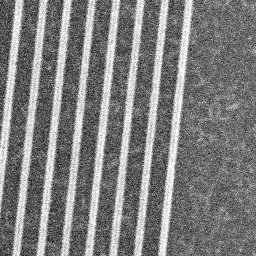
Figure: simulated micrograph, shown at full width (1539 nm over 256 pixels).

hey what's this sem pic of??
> parallel lines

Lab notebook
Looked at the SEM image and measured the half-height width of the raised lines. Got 29.8 nm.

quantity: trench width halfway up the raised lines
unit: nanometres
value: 116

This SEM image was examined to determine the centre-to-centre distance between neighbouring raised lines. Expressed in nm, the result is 145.